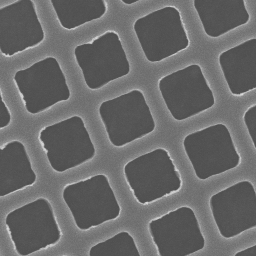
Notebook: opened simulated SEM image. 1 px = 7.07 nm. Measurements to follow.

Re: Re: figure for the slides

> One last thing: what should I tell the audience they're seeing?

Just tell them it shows a regular array of holes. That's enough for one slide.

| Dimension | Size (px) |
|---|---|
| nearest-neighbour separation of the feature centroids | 63.3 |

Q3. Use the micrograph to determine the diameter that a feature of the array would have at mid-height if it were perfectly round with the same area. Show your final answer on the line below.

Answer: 0.36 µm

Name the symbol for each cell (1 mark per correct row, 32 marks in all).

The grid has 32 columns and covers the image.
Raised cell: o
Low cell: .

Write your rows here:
oo..ooo......ooooooooooo......oo
....ooo......oooooo...ooo......o
.....oo.....ooooo......oo......o
.....ooo.oooooooo......ooo...ooo
.....oooooooo..oo......ooo.ooooo
....ooooooo....ooo.....ooooooo..
..ooooooo.......oo....oooooo....
ooooo..ooo......ooo.ooooooo.....
ooo....ooo......ooooooo..ooo....
oo......oo.....oooooo....ooo....
oo......ooo..ooooooo......ooo...
ooo......ooooooooooo......ooo..o
ooo.....oooooo....ooo......ooooo
.oo...oooooo.......oo.....ooooo.
.oooooooooooo......ooo..ooooooo.
.oooooo...ooo......oooooooooooo.
ooooo......oo......oooooo....oo.
ooooo......ooo...oooooo......ooo
...ooo......ooooooooooo......ooo
...ooo......oooooo...ooo......oo
....oo....oooooo......oo......oo
....oooooooooooo......oo....oooo
....ooooooo..ooo......oooooooooo
...ooooo......oo......ooooooo...
oooooooo......ooo...ooooooo.....
oooo..oo.......ooooooooooo......
o......oo......oooooo...ooo.....
o......oo....oooooo......oo.....
o......ooo.oooooooo......oo....o
o......ooooooo..ooo......ooo.ooo
oo....oooooo.....oo.......oooooo
oo..ooooooo......ooo....oooooo..